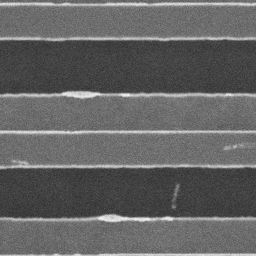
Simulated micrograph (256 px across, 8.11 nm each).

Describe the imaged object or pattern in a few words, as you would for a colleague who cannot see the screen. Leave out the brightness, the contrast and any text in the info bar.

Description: lines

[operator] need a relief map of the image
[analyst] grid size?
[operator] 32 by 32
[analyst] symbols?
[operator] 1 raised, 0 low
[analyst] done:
11111111111111111111111111111111
11111111111111111111111111111111
11111111111111111111111111111111
11111111111111111111111111111111
11111111111111111111111111111111
00000000000000000000000000000000
00000000000000000000000000000000
00000000000000000000000000000000
00000000000000000000000000000000
00000000000000000000000000000000
00000000000000000000000000000000
00000000111100000000000000000000
11111111111111111111111111111111
11111111111111111111111111111111
11111111111111111111111111111111
11111111111111111111111111111111
11111111111111111111111111111111
11111111111111111111111111111111
11111111111111111111111111111111
11111111111111111111111111111111
11111111111111111111111111111111
00000000000000000000000000000000
00000000000000000000000000000000
00000000000000000000000000000000
00000000000000000000000000000000
00000000000000000000000000000000
00000000000000000000000000000000
11111111111111111111111111111111
11111111111111111111111111111111
11111111111111111111111111111111
11111111111111111111111111111111
11111111111111111111111111111111